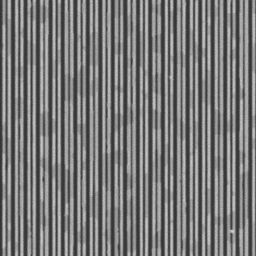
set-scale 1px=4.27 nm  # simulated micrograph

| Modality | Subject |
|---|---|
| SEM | parallel lines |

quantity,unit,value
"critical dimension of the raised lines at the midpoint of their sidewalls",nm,14.9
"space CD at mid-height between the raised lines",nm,14.4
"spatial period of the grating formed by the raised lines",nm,26.6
